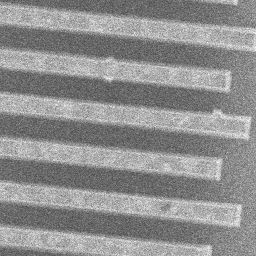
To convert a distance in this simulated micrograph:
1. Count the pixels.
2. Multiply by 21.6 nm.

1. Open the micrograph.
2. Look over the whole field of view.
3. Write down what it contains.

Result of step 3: parallel lines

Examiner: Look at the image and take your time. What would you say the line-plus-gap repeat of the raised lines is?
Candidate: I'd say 951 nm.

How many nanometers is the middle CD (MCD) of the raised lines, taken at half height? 397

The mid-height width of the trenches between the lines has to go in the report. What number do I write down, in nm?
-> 548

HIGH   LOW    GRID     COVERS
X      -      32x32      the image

--------------------------------
XXXXXXXXX-----------------------
XXXXXXXXXXXXXXXXXX--------------
------XXXXXXXXXXXXXXXXXXXXXX----
----------------XXXXXXXXXXXXXXXX
-------------------------XXXXXXX
XXXX----------------------------
XXXXXXXXXXXXXX------------------
-XXXXXXXXXXXXXXXXXXXXXX---------
-----------XXXXXXXXXXXXXXXXXX---
---------------------XXXXXXX----
--------------------------------
XXXXXXXX------------------------
XXXXXXXXXXXXXXXXX---------------
-----XXXXXXXXXXXXXXXXXXXXXXX----
---------------XXXXXXXXXXXXXXXX-
------------------------XXXXXXX-
XXX-----------------------------
XXXXXXXXXXXXX-------------------
XXXXXXXXXXXXXXXXXXXXXX----------
----------XXXXXXXXXXXXXXXXX-----
--------------------XXXXXXX-----
--------------------------------
XXXXXXX-------------------------
XXXXXXXXXXXXXXXXXX--------------
-----XXXXXXXXXXXXXXXXXXXXX------
--------------XXXXXXXXXXXXXXXX--
------------------------XXXXXX--
XX------------------------------
XXXXXXXXXXXX--------------------
XXXXXXXXXXXXXXXXXXXXX-----------
---------XXXXXXXXXXXXXXXXX------